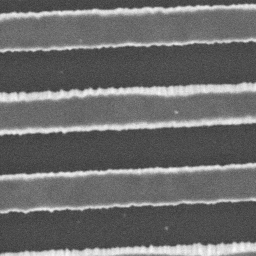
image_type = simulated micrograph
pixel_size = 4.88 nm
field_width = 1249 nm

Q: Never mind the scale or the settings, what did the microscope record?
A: lines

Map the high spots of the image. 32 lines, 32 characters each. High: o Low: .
................................
......oooooooooooooooooooooooooo
oooooooooooooooooooooooooooooooo
oooooooooooooooooooooooooooooooo
oooooooooooooooooooooooooooooooo
ooooooooooooooooooooooo.........
................................
................................
................................
................................
................................
.........ooooooooooooooooooooooo
oooooooooooooooooooooooooooooooo
oooooooooooooooooooooooooooooooo
oooooooooooooooooooooooooooooooo
oooooooooooooooooooooooooooooo..
ooooooooo.......................
................................
................................
................................
...............................o
.........ooooooooooooooooooooooo
oooooooooooooooooooooooooooooooo
oooooooooooooooooooooooooooooooo
oooooooooooooooooooooooooooooooo
oooooooooooooooooooooo..........
o...............................
................................
................................
................................
................................
...........ooooooooooooooooooooo